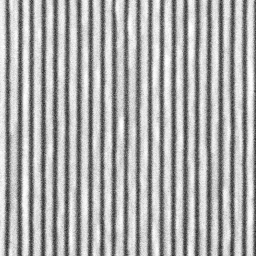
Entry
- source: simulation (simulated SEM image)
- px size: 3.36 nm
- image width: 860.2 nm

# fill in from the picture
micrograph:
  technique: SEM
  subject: parallel lines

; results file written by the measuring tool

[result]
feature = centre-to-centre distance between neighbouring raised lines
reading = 39.7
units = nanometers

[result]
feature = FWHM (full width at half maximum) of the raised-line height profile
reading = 19.7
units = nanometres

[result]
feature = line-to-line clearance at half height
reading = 19.7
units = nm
